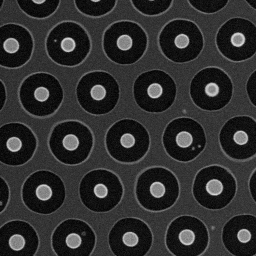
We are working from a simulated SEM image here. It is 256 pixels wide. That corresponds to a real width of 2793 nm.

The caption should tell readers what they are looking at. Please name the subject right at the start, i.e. an array of small figures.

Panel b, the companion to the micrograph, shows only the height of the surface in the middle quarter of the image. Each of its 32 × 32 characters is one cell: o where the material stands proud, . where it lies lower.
...ooooooooooooooooooooooooooooo
oooooooooooooooooooooo..oooooooo
ooooo......oooooooo.......oooooo
oooo........oooooo.........ooooo
oooo.........ooooo..........oooo
ooo.....o.....ooo.....oo....ooo.
ooo....ooo....ooo....ooo....ooo.
ooo....ooo....ooo....ooo....oooo
ooo....ooo....oooo..........oooo
oooo.........ooooo.........ooooo
oooo.........oooooo........ooooo
ooooo.......oooooooo......oooooo
ooooooo...oooooooooooooooooooooo
oooooooooooooooooooooooooooo...o
....ooooooooo......oooooooo.....
......oooooo........oooooo......
.......oooo..........oooo.......
.......ooo.....o.....oooo....oo.
ooo.....oo....ooo....ooo....oooo
oooo....oo....ooo....oooo...oooo
ooo....oooo....oo....oooo....oo.
.......oooo..........oooo.......
......ooooo.........oooooo......
......oooooo........ooooooo.....
.....ooooooooo....oooooooooooo.o
oooooooooooooooooooooooooooooooo
ooooooo....ooooooooo......oooooo
oooooo.......oooooo........ooooo
ooooo.........oooo..........oooo
oooo..........oooo...........ooo
oooo....oo.....ooo....ooo....ooo
oooo....ooo....ooo....ooo....ooo